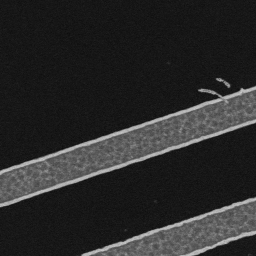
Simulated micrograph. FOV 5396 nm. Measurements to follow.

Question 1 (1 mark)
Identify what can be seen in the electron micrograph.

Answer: one or a few lines or trenches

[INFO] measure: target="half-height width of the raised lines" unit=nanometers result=665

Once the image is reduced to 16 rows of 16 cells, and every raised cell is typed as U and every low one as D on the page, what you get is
DDDDDDDDDDDDDDDD
DDDDDDDDDDDDDDDD
DDDDDDDDDDDDDDDD
DDDDDDDDDDDDDDDD
DDDDDDDDDDDDDDDD
DDDDDDDDDDDDDDDD
DDDDDDDDDDDDDUUU
DDDDDDDDDDUUUUUU
DDDDDDDUUUUUUDDD
DDDDUUUUUUDDDDDD
DUUUUUUDDDDDDDDD
UUUUDDDDDDDDDDDD
UDDDDDDDDDDDDDDD
DDDDDDDDDDDDDUUU
DDDDDDDDDDUUUUUU
DDDDDDDUUUUUUDDD